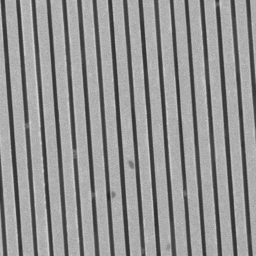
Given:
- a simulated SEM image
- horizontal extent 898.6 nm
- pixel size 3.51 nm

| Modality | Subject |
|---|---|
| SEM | parallel lines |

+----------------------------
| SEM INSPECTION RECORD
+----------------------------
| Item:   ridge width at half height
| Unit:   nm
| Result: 39.8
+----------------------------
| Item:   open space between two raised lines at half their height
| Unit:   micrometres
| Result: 0.0153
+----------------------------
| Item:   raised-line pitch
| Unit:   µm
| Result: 0.0536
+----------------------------